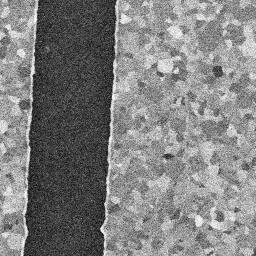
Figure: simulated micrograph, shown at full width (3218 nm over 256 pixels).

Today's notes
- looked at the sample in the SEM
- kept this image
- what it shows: one or a few lines or trenches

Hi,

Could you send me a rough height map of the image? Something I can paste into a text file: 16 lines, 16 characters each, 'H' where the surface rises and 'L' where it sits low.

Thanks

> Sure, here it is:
HHLLLLLHHHHHHHHH
HHLLLLLHHHHHHHHH
HHLLLLLHHHHHHHHH
HHLLLLLHHHHHHHHH
HHLLLLLHHHHHHHHH
HHLLLLLHHHHHHHHH
HHLLLLLHHHHHHHHH
HHLLLLLHHHHHHHHH
HHLLLLLHHHHHHHHH
HHLLLLLHHHHHHHHH
HHLLLLLHHHHHHHHH
HHLLLLLHHHHHHHHH
HHLLLLLHHHHHHHHH
HHLLLLLHHHHHHHHH
HHLLLLHHHHHHHHHH
HLLLLLLHHHHHHHHH